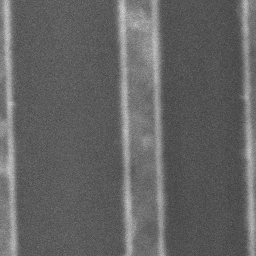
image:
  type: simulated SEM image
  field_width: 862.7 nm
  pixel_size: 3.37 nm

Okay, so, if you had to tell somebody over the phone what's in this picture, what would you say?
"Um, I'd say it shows one or a few lines or trenches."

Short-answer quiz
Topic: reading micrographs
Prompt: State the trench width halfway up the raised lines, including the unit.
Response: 345 nm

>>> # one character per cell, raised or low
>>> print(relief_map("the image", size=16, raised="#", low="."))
........##.....#
........##.....#
........##.....#
#.......##.....#
#.......##.....#
#.......##.....#
#.......##.....#
#.......##......
#.......##......
#.......##......
#.......##......
#.......##......
#.......##......
#.......##......
#.......##......
#.......##......